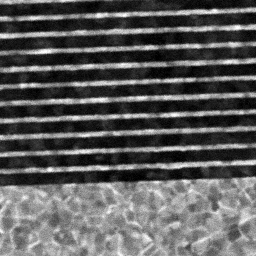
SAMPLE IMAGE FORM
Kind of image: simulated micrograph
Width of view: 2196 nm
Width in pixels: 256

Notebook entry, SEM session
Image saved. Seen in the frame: parallel lines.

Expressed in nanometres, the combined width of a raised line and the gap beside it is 145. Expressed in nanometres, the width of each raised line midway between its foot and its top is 31.1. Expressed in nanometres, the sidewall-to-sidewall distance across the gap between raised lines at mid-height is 112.